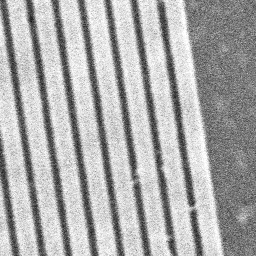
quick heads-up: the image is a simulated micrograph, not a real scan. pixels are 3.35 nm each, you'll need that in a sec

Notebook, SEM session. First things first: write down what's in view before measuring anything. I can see parallel lines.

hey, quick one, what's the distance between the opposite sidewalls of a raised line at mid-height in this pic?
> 0.0525 micrometres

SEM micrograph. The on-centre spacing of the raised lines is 86.8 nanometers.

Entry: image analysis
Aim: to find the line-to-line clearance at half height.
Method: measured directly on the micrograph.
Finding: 34.8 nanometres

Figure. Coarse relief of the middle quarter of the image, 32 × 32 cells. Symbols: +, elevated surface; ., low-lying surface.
..+++...++++...++++..++++...++++
..++++..++++...++++...+++...++++
..++++...+++...++++...++++..++++
..++++...++++..++++...++++..++++
..++++...++++..++++...++++...+++
..++++...++++...+++...++++...+++
...+++...++++...++++..++++...+++
...++++..++++...++++..++++...+++
...++++..++++...++++...++++..+++
...++++...+++...++++...++++..+++
+..++++...++++..++++...++++..+++
+..++++...++++..++++...++++...++
+..++++...++++...++++..++++...++
+...+++...++++...++++..++++...++
+...++++..++++...++++...+++...++
+...++++...+++...++++...++++..++
+...++++...++++..++++...++++..++
++..++++...++++..++++...++++..++
++..++++...++++...+++...++++...+
++...+++...++++...++++..++++...+
++...++++..++++...++++...+++...+
++...++++...+++...++++...++++..+
++...++++...+++...++++...++++..+
+++..++++...++++..++++...++++..+
+++..++++...++++...+++...++++...
+++...+++...++++...+++...++++...
+++...++++..++++...++++..++++...
+++...++++..++++...++++..++++...
+++...++++...+++...++++...++++..
++++..++++...++++..++++...++++..
++++..++++...++++...+++...++++..
++++..++++...++++...++++..++++..